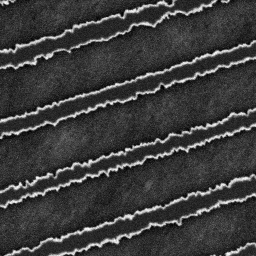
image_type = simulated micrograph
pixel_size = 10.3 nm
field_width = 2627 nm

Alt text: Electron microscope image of one or a few lines or trenches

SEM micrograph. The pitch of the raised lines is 663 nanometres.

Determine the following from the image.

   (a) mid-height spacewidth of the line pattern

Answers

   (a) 499 nm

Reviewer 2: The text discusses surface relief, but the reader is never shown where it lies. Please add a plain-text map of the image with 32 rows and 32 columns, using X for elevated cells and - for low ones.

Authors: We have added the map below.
--------------------XXXXXX------
----------------XXXXXXXX--------
-------------XXXXXXX------------
---------XXXXXXX----------------
-------XXXXXXX------------------
----XXXXXXX--------------------X
XXXXXXX--------------------XXXXX
XXXXX-------------------XXXXXXX-
---------------------XXXXXX-----
------------------XXXXXXX-------
---------------XXXXXX-----------
------------XXXXXXX-------------
--------XXXXXXXX----------------
-----XXXXXXX--------------------
---XXXXXX--------------------XXX
XXXXXX---------------------XXXXX
XX---------------------XXXXXX---
---------------------XXXXX------
-----------------XXXXXXX--------
--------------XXXXXX------------
---------X-XXXXXX---------------
-------XXXXXXX------------------
----XXXXXX-------------------XXX
-XXXXXX--------------------XXXXX
XXXX--------------------XXXXXXX-
X--------------------XXXXXXX----
------------------XXXXXXX-------
--------------XXXXXXXXX---------
------------XXXXXX--------------
--------XXXXXXX-----------------
-----XXXXXXXX------------------X
--XXXXXXXX-------------------XXX